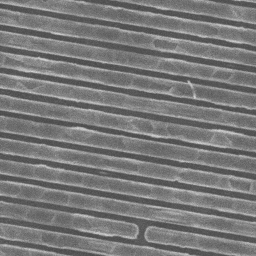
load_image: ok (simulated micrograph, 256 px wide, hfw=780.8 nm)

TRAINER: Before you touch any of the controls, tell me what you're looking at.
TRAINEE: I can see parallel lines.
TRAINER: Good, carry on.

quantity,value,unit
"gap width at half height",19.2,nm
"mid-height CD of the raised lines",44.8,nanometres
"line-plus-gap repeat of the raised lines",0.0643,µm